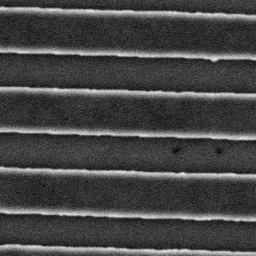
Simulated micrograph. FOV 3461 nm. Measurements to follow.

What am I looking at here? lines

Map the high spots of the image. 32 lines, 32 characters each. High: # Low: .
................................
#################...............
################################
################################
################################
################################
..##############################
................................
................................
................................
................................
#####################...........
################################
################################
################################
################################
..##############################
................................
................................
................................
................................
#################...............
################################
################################
################################
################################
################################
.............................###
................................
................................
................................
##############################..